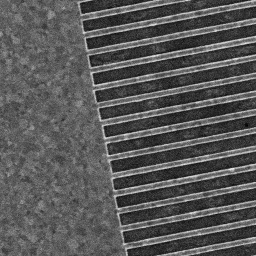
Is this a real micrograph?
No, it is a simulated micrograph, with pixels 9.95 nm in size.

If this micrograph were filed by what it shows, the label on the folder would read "parallel lines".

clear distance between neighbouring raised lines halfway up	12.5	px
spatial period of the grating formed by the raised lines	0.178	micrometres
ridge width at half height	47.6	nm